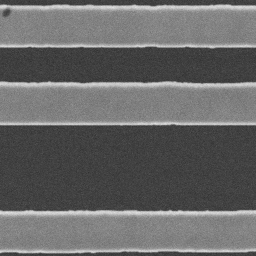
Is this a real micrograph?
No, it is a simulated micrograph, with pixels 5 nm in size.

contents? lines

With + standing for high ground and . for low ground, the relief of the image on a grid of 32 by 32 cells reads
................................
++++++++++++++++++++++++++++++++
++++++++++++++++++++++++++++++++
++++++++++++++++++++++++++++++++
++++++++++++++++++++++++++++++++
++++++++++++++++++++++++++++++++
................................
................................
................................
................................
+++++++++++++++++++++++++.+.++++
++++++++++++++++++++++++++++++++
++++++++++++++++++++++++++++++++
++++++++++++++++++++++++++++++++
++++++++++++++++++++++++++++++++
++++++++++++++++++++++++++++++++
................................
................................
................................
................................
................................
................................
................................
................................
................................
................................
+..+++++++++++++++++++++++++++++
++++++++++++++++++++++++++++++++
++++++++++++++++++++++++++++++++
++++++++++++++++++++++++++++++++
++++++++++++++++++++++++++++++++
+.++++++++++....................